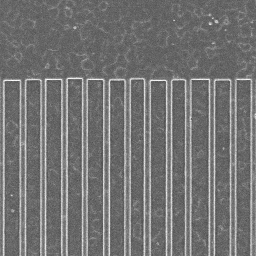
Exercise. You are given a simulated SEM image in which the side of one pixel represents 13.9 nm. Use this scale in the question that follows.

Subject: parallel lines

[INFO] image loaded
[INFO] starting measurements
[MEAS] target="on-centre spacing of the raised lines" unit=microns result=0.292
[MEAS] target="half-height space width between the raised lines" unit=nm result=205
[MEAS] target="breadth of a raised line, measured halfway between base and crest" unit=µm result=0.0834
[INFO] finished